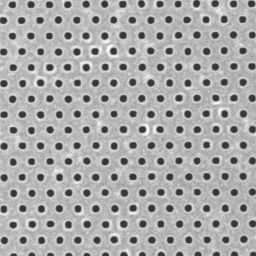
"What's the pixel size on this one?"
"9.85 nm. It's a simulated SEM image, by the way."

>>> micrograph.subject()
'a regular array of holes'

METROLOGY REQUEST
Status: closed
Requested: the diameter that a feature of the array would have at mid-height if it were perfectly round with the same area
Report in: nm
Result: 76.2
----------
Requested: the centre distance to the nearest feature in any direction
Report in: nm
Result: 174